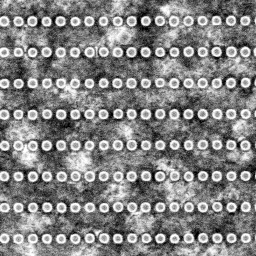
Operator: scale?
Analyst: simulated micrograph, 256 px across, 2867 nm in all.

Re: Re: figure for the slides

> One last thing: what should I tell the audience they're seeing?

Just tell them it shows a regular array of raised bodies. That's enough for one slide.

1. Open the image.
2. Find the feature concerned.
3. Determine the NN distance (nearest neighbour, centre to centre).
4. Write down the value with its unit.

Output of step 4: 156 nm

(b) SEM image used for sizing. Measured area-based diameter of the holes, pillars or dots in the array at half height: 102 nanometers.